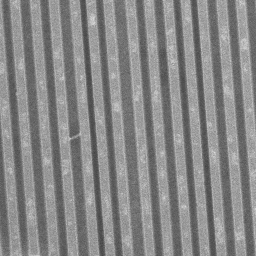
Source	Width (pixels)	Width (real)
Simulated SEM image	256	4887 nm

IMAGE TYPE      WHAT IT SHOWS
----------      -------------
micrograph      parallel lines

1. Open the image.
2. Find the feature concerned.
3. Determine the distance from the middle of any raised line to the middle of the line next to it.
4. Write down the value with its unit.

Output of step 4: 358 nanometres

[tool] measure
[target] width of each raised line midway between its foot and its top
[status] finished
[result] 186 nm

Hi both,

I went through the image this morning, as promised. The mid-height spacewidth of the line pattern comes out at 8.85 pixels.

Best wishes